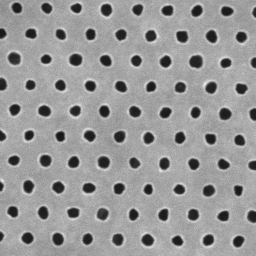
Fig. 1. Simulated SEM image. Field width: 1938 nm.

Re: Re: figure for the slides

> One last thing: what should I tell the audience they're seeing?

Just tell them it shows a regular array of holes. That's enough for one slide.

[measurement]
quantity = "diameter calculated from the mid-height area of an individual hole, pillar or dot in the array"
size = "84.6 nanometers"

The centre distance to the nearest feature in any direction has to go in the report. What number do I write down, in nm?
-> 219